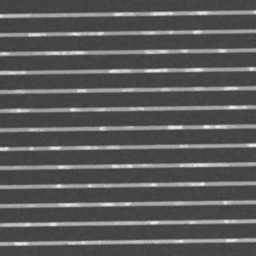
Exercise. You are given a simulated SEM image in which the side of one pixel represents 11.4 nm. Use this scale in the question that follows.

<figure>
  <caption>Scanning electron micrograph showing parallel lines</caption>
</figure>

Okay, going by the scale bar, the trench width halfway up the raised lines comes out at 16.1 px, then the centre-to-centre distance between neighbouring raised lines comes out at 216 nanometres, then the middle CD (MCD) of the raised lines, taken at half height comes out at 32.6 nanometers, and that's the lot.